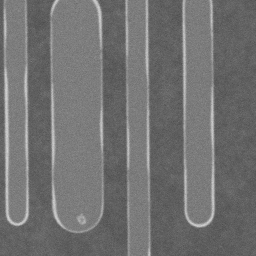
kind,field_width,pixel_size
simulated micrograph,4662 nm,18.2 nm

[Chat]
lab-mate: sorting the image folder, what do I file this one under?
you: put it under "groups of lines, slits or small figures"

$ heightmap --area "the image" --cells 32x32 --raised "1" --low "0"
01100001111100001100000111000000
01100011111100001100000111000000
01100011111110001100000111000000
01100011111110001100000111100000
01100011111110001100000111100000
01100011111110001100000111100000
01100011111110001100000111100000
01100011111110001100000111100000
01100011111110001100000111100000
01100011111110001100000111100000
01100011111110001100000111100000
01100001111110001100000111100000
01100001111110001100000111100000
01100001111110001100000111100000
01100001111110001100000111100000
01100001111110001100000111100000
01100001111110001100000111100000
01100001111110001100000111100000
01100001111110001100000111100000
01100001111110001100000111100000
01100001111110001100000111100000
01100001111110001110000111100000
01100001111110001110000111100000
01100001111110001110000111100000
01100001111110001110000111100000
01100001111110001110000111100000
01100001111110001110000111100000
01100001111100001110000011000000
00000000111000001110000000000000
00000000000000001110000000000000
00000000000000001110000000000000
00000000000000001110000000000000